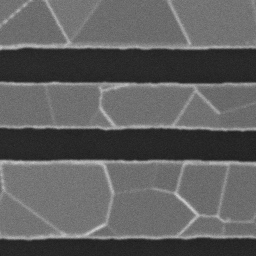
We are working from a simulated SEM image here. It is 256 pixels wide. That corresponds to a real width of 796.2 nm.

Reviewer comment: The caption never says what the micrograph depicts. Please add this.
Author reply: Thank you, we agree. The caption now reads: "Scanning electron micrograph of lines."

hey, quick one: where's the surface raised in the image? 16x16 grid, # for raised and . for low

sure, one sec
################
################
################
................
................
################
################
################
................
................
################
################
################
################
################
................